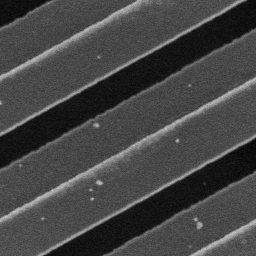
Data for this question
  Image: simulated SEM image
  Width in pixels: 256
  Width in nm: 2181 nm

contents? lines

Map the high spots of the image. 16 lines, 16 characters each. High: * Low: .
..************..
.************...
***********....*
*********....***
*******....*****
*****....*******
****....********
**....**********
....************
..************..
*************...
***********....*
*********....***
*******....*****
*****....*******
***....*********